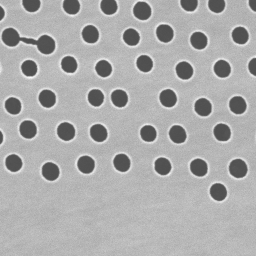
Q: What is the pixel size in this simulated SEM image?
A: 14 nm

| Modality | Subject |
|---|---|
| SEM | a regular array of holes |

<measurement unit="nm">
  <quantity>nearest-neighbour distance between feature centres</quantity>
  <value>448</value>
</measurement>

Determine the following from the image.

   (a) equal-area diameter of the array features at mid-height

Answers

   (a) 255 nanometres